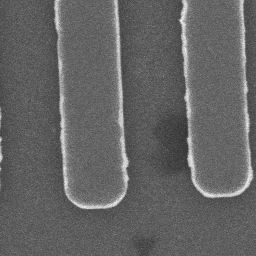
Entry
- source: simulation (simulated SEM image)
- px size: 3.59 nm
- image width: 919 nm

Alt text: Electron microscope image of one or a few lines or trenches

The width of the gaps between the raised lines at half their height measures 0.227 µm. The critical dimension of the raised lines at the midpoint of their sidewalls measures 224 nanometres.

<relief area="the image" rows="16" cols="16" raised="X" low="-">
---XXXX----XXXX-
---XXXX----XXXX-
----XXX----XXXX-
----XXXX---XXXX-
----XXXX----XXX-
----XXXX----XXX-
----XXXX----XXX-
----XXXX----XXXX
----XXXX----XXXX
----XXXX----XXXX
----XXXX----XXXX
----XXXX----XXXX
----XXXX--------
----------------
----------------
----------------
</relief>